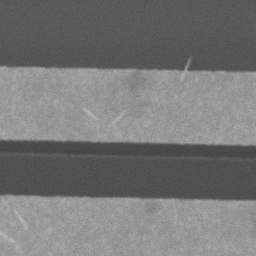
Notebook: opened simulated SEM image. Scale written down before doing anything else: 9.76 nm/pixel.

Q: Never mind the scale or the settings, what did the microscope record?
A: lines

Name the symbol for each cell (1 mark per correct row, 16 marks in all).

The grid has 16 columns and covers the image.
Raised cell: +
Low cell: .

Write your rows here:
................
................
................
................
+++++++++++++++.
++++++++++++++++
++++++++++++++++
++++++++++++++++
++++++++++++++++
................
................
................
++++++++++++....
++++++++++++++++
++++++++++++++++
++++++++++++++++